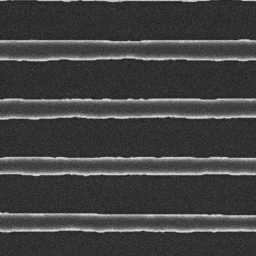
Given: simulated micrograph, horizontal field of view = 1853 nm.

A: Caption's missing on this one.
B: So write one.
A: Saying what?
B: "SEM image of lines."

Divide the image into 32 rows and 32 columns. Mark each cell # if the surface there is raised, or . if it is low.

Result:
................................
................................
................................
................................
................................
################################
################################
...###.....................#..#.
................................
................................
................................
................................
###.....######..#########..#####
################################
################################
................................
................................
................................
................................
................................
################################
################################
................................
................................
................................
................................
................................
################################
################################
................................
................................
................................